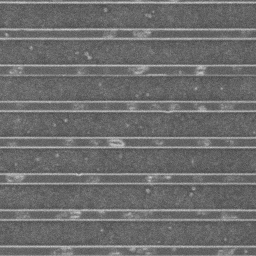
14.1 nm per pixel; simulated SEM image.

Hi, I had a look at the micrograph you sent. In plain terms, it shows parallel lines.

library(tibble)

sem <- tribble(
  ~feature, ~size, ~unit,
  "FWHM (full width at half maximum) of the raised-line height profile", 141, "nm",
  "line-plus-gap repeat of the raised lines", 512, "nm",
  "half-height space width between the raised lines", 373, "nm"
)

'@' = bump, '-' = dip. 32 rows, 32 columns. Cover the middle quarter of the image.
@@@@@@@@@@@@@@@@----------------
@@@@@@@@@@@@@@@@@@@@@@@@@@@@@@@@
@@@@@@@@@@@@@@@@@@@@@@@@@@@@@@@@
--------------------------------
--------------------------------
--------------------------------
--------------------------------
--------------------------------
--------------------------------
--------------------------------
@@@@@@@@@@@@@@@@@@@@@@@@@@@@@@@@
@@@@@@@@@@@@@@@@@@@@@@@@@@@@@@@@
--------------------------------
--------------------------------
--------------------------------
--------------------------------
--------------------------------
--------------------------------
@@@@@@@@@@@@@@@@@@@@@@-------@@@
@@@@@@@@@@@@@@@@@@@@@@@@@@@@@@@@
@@@@@@@@@@@@@@@@@@@@@@@@@@@@@@@@
--------------------------------
--------------------------------
--------------------------------
--------------------------------
--------------------------------
--------------------------------
--------------------------------
@@@@@@@@@@@@@@@@@@@@@@@@@@@@@@@@
@@@@@@@@@@@@@@@@@@@@@@@@@@@@@@@@
--------------------------------
--------------------------------